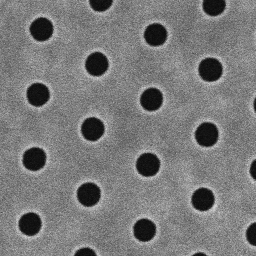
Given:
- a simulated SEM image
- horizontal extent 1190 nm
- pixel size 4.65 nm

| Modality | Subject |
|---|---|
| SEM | a regular array of holes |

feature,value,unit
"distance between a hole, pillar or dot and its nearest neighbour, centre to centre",302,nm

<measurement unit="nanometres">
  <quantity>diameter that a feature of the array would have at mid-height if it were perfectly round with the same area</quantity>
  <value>112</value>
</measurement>